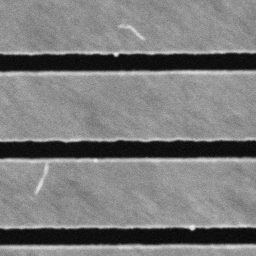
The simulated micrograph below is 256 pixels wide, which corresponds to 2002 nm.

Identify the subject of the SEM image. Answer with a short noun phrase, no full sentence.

lines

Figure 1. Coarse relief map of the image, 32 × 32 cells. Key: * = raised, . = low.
********************************
********************************
********************************
********************************
********************************
********************************
********************************
................................
................................
********************************
********************************
********************************
********************************
********************************
********************************
********************************
********************************
********************************
................................
................................
********************************
********************************
********************************
********************************
********************************
********************************
********************************
********************************
*.*.....................*.......
................................
................................
********************************